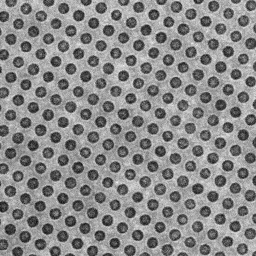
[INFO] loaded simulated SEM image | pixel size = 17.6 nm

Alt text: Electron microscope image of a regular array of holes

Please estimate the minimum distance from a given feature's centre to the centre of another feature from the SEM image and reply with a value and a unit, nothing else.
292 nm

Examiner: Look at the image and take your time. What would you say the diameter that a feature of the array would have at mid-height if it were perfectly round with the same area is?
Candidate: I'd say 211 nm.